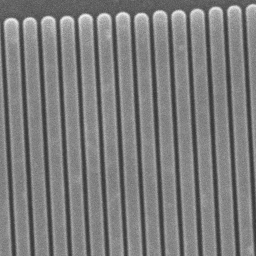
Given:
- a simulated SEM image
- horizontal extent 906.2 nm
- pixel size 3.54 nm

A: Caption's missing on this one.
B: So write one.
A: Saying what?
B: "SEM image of parallel lines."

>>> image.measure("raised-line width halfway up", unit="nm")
47.7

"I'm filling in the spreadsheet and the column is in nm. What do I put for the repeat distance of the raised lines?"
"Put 65.9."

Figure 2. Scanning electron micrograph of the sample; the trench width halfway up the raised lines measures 18.6 nm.